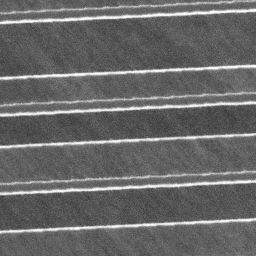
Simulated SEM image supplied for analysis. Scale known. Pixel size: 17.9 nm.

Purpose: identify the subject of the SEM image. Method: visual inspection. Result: lines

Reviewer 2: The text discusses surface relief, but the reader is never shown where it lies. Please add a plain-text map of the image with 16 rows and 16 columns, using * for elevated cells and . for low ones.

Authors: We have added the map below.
****************
................
................
................
.........*******
****************
**************..
................
..............**
****************
****************
************....
................
................
.***************
****************